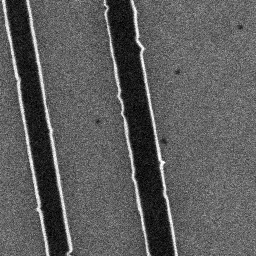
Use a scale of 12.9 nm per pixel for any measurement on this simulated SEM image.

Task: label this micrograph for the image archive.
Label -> one or a few lines or trenches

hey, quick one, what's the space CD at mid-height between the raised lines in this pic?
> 952 nm